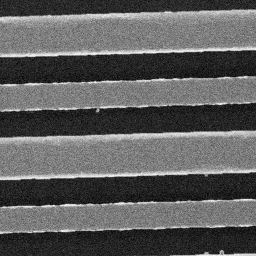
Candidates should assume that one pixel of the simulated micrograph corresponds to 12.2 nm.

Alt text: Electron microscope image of lines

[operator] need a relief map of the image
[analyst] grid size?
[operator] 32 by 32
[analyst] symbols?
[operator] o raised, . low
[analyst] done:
................................
................................
oooooooooooooooooooooooooooooooo
oooooooooooooooooooooooooooooooo
oooooooooooooooooooooooooooooooo
oooooooooooooooooooooooooooooooo
ooooooooooooooooooo.............
................................
................................
................................
.......ooooooooooooooooooooooooo
oooooooooooooooooooooooooooooooo
oooooooooooooooooooooooooooooooo
oooooooooooo....................
................................
................................
................................
.ooooooooooooooooooooooooooooooo
oooooooooooooooooooooooooooooooo
oooooooooooooooooooooooooooooooo
oooooooooooooooooooooooooooooooo
ooooooooooooooooooooooooo.......
................................
................................
................................
..............oooooooooooooooooo
oooooooooooooooooooooooooooooooo
oooooooooooooooooooooooooooooooo
ooooooooooooooooooooo...........
................................
................................
................................